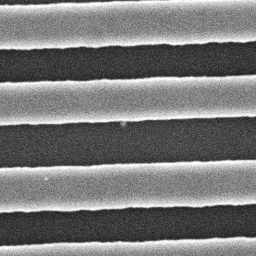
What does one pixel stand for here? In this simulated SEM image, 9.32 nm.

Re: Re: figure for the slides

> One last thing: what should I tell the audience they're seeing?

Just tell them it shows lines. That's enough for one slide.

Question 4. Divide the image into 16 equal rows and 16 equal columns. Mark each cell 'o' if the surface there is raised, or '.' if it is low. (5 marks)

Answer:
oooooooooooooooo
oooooooooooooooo
oooooooooooooooo
................
................
oooooooooooooooo
oooooooooooooooo
ooooooooo.......
................
................
.ooooooooooooooo
oooooooooooooooo
oooooooooooooooo
................
................
oooooooooooooooo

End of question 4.